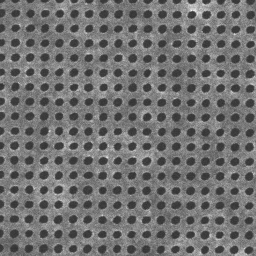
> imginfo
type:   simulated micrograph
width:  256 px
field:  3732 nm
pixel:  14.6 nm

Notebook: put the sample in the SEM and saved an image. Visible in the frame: a regular array of holes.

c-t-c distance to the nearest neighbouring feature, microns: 0.21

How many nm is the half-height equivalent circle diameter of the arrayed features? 128